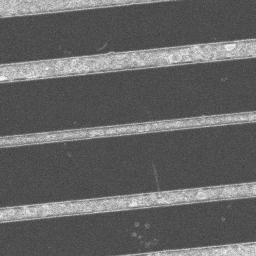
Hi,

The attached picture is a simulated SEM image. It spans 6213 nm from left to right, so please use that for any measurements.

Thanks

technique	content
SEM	one or a few lines or trenches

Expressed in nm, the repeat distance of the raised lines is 1640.